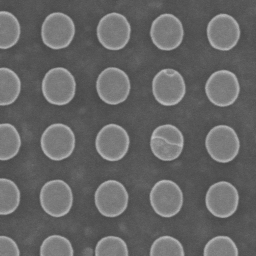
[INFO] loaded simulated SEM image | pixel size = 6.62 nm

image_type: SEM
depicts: a regular array of raised bodies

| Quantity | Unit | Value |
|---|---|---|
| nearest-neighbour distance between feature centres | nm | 361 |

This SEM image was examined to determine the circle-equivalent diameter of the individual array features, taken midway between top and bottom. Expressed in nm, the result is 224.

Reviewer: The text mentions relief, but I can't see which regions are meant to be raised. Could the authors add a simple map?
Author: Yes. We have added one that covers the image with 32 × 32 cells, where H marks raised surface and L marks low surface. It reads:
LLLLLLLLLLLLLLLLLLLLLLLLLLLLLLLL
LLLLLLLLLLLLLLLLLLLLLLLLLLLLLLLL
HHLLLLHHHLLLLHHHLLLHHHLLLLLHHLLL
HHLLLHHHHLLLHHHHLLLHHHHLLLHHHHLL
HHLLLHHHHLLLHHHHLLLHHHHLLLHHHHLL
HHLLLLHHLLLLLHHHLLLHHHLLLLLHHLLL
LLLLLLLLLLLLLLLLLLLLLLLLLLLLLLLL
LLLLLLLLLLLLLLLLLLLLLLLLLLLLLLLL
LLLLLLLLLLLLLLLLLLLLLLLLLLLLLLLL
HHLLLLHHHLLLHHHHLLLLHHHLLLHHHLLL
HHLLLHHHHLLLHHHHLLLHHHHLLLHHHHLL
HHLLLHHHHLLLHHHHLLLHHHHLLLHHHHLL
HHLLLLHHHLLLLHHLLLLLHHLLLLHHHLLL
LLLLLLLLLLLLLLLLLLLLLLLLLLLLLLLL
LLLLLLLLLLLLLLLLLLLLLLLLLLLLLLLL
LLLLLLLLLLLLLLLLLLLLLLLLLLLLLLLL
HHLLLLHHHLLLLHHHLLLHHHLLLLHHHLLL
HHLLLHHHHLLLHHHHLLLHHHHLLLHHHHLL
HHLLLHHHHLLLHHHHLLLHHHHLLLHHHHLL
HHLLLLHHLLLLLHHLLLLLHHLLLLHHHLLL
LLLLLLLLLLLLLLLLLLLLLLLLLLLLLLLL
LLLLLLLLLLLLLLLLLLLLLLLLLLLLLLLL
HLLLLLLLLLLLLLLLLLLLLLLLLLLLLLLL
HHLLLHHHHLLLHHHLLLLHHHLLLLHHHLLL
HHLLLHHHHLLLHHHHLLLHHHHLLLHHHHLL
HHLLLHHHHLLLHHHHLLLHHHHLLLHHHHLL
HLLLLLHHLLLLLHHLLLLLHHLLLLHHHLLL
LLLLLLLLLLLLLLLLLLLLLLLLLLLLLLLL
LLLLLLLLLLLLLLLLLLLLLLLLLLLLLLLL
LLLLLLLLLLLLLLLLLLLLLLLLLLLLLLLL
HHLLLHHHHLLLHHHHLLLHHHLLLLHHHLLL
HHLLLHHHHLLLHHHHLLLHHHHLLLHHHHLL